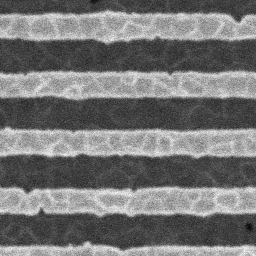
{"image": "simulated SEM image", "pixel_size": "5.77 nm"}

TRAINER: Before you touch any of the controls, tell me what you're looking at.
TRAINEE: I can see parallel lines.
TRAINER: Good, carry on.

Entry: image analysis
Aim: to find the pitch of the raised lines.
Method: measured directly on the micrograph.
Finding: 0.335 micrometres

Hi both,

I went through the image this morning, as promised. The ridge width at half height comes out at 130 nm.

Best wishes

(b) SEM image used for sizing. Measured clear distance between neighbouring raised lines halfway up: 0.205 microns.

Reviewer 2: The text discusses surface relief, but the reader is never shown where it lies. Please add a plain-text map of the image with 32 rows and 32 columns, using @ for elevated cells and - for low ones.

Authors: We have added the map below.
--------------------------------
--------------------------------
@@@@@@@@@@@@@@@@@@@@@@@@@@@@@-@@
@@@@@@@@@@@@@@@@@@@@@@@@@@@@@@@@
@@@@@@@@@@@@@@@@@@@-@@@@@@@@@@@@
--------------------------------
--------------------------------
--------------------------------
--------------------------------
@@@@@@@@@@@@@@@@@@@@@@@@@@@@@@@@
@@@@@@@@@@@@@@@@@@@@@@@@@@@@@@@@
@@@@@@@@@@@@@@@@@@@@@@@@@@@@@@@@
--------------------------------
--------------------------------
--------------------------------
--------------------------------
@@@@@@@@@-@@@@@-----------@-@@@@
@@@@@@@@@@@@@@@@@@@@@@@@@@@@@@@@
@@@@@@@@@@@@@@@@@@@@@@@@@@@@@@@@
------------------------@-------
--------------------------------
--------------------------------
--------------------------------
--------------@-----------------
@@@@@@@@@@@@@@@@@@@@@@@@@@@@@@@@
@@@@@@@@@@@@@@@@@@@@@@@@@@@@@@@@
-@@@@-@@@@-@@@-@@@@@@@@@@@@--@@-
--------------------------------
--------------------------------
--------------------------------
--------------------------------
@@@@@@@@@@@@@@@@@@@@@@@@@@@@@@@@